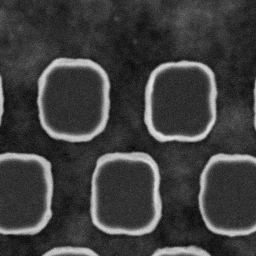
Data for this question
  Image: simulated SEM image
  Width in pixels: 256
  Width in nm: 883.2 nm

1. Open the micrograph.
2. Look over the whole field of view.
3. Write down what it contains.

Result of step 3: raised bodies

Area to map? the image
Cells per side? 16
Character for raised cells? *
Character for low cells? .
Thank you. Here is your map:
................
................
................
................
...***....***...
...****..****...
..*****..****...
...****..****...
....**....***...
................
***...****...***
***...****...***
***...****..****
***...****...***
*......**.....**
................